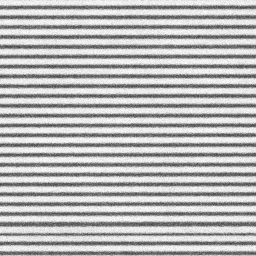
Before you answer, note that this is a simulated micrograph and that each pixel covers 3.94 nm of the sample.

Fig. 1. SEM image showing parallel lines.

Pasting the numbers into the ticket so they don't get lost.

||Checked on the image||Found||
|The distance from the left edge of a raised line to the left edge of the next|38.8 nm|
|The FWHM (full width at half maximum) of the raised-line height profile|20.7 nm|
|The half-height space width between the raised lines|17.2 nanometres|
